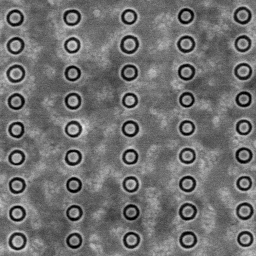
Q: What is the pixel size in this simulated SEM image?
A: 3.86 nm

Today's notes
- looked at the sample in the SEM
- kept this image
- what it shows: a regular array of ring-shaped grooves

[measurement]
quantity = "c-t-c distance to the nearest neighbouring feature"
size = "107 nanometers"